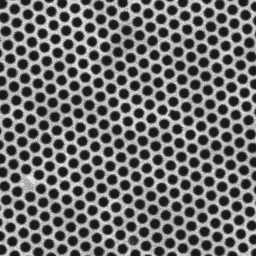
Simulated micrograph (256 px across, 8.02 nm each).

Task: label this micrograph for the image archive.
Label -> a regular array of holes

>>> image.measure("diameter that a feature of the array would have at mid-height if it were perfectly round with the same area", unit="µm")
0.0844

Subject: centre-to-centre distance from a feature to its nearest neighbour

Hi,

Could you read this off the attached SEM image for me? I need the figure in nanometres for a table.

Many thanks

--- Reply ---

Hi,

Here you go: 109